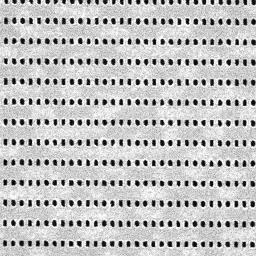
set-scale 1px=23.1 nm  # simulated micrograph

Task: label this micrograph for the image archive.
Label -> a regular array of holes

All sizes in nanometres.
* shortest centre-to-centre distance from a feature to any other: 187